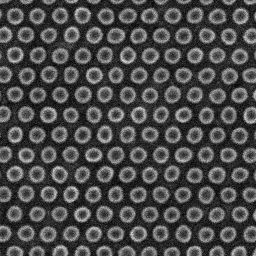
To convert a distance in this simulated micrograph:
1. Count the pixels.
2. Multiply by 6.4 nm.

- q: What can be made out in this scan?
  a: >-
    a regular array of raised bodies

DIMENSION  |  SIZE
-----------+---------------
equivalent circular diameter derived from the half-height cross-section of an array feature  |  95.6 nm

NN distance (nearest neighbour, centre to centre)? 141 nm